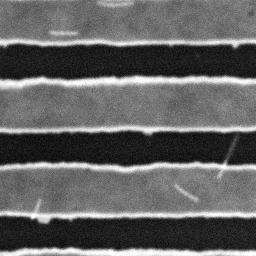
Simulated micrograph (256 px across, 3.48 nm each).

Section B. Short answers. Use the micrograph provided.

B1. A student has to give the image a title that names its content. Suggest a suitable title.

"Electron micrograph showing lines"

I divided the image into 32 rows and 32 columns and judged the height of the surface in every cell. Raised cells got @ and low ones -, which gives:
@@@@@@@@@@@@@@@@@@@@@@@@@@@@@@@@
@@@@@@@@@@@@@@@@@@@@@@@@@@@@@@@@
@@@@@@@@@@@@@@@@@@@@@@@@@@@@@@@@
@@@@@@@@@@@@@@@@@@@@@@@@@@@@@@@@
@@@@@@@@@@@@@@@@@@@@@@@@@@@@@@@@
----@@@@@----@@@@-------@@------
--------------------------------
--------------------------------
--------------------------------
--------------------------------
@@@@@@@@@@@@@@@@@@@@@@@@@@@@@@@@
@@@@@@@@@@@@@@@@@@@@@@@@@@@@@@@@
@@@@@@@@@@@@@@@@@@@@@@@@@@@@@@@@
@@@@@@@@@@@@@@@@@@@@@@@@@@@@@@@@
@@@@@@@@@@@@@@@@@@@@@@@@@@@@@@@@
@@@@@@@@@@@@@@@@@@@@@@@@@@@@@@@@
@@@-@@--------------------------
--------------------------------
--------------------------------
--------------------------------
---@@@@@@@@--------@@@--@@------
@@@@@@@@@@@@@@@@@@@@@@@@@@@@@@@@
@@@@@@@@@@@@@@@@@@@@@@@@@@@@@@@@
@@@@@@@@@@@@@@@@@@@@@@@@@@@@@@@@
@@@@@@@@@@@@@@@@@@@@@@@@@@@@@@@@
@@@@@@@@@@@@@@@@@@@@@@@@@@@@@@@@
@@@@@@@@@@@@@@@@@@@@@@@@@@@@@@@@
--------------------------------
--------------------------------
--------------------------------
--------------------------------
@@@@@@@@@@@@@@@@@@@@@@@@@@@@@@@@